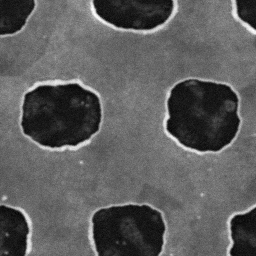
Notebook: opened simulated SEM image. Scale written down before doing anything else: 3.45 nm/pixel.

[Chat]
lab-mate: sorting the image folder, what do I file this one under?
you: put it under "holes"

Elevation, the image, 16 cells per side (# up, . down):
..####.....####.
..#####...#####.
################
################
################
##...######...##
#.....####.....#
#.....####.....#
##....#####....#
################
################
################
################
.#####....#####.
..####....####..
..####....####..